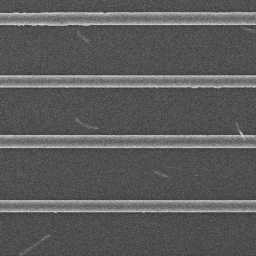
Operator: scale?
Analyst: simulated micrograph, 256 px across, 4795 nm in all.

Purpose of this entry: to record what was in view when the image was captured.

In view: lines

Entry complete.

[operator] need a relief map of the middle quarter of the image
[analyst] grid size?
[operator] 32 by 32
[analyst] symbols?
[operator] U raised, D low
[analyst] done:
DDDDDDDDDDDDDDDDDDDDDDDDDDDDDDDD
DDDDDDDDDDDDDDDDDDDDDDDDDDDDDDDD
DDDDDDDDDDDDDDDDDDDDDDDDDDDDDDDD
UUUUUUUUUUUUUUUUUUUUUUUUUUUUUUUU
UUUUUUUUUUUUUUUUUUUUUUUUUUUUUUUU
UUUUUUUUUUUUUUUUUUUUUUUUUUUUUUUU
DDDDDDDDDDDDDDDDDDDDDDDDDDDDDDDD
DDDDDDDDDDDDDDDDDDDDDDDDDDDDDDDD
DDDDDDDDDDDDDDDDDDDDDDDDDDDDDDDD
DDDDDDDDDDDDDDDDDDDDDDDDDDDDDDDD
DDDDDDDDDDDDDDDDDDDDDDDDDDDDDDDD
DDDDDDDDDDDDDDDDDDDDDDDDDDDDDDDD
DDDDDDDDDDDDDDDDDDDDDDDDDDDDDDDD
DDDDDDDDDDDDDDDDDDDDDDDDDDDDDDDD
DDDDDDDDDDDDDDDDDDDDDDDDDDDDDDDD
DDDDDDDDDDDDDDDDDDDDDDDDDDDDDDDD
DDDDDDDDDDDDDDDDDDDDDDDDDDDDDDDD
DDDDDDDDDDDDDDDDDDDDDDDDDDDDDDDD
UUUUUUUUUUUUUUUUUUUUUUUUUUUUUUUU
UUUUUUUUUUUUUUUUUUUUUUUUUUUUUUUU
UUUUUUUUUUUUUUUUUUUUUUUUUUUUUUUU
DDDDDDDDDDDDDDDDDDDDDDDDDDDDDDDD
DDDDDDDDDDDDDDDDDDDDDDDDDDDDDDDD
DDDDDDDDDDDDDDDDDDDDDDDDDDDDDDDD
DDDDDDDDDDDDDDDDDDDDDDDDDDDDDDDD
DDDDDDDDDDDDDDDDDDDDDDDDDDDDDDDD
DDDDDDDDDDDDDDDDDDDDDDDDDDDDDDDD
DDDDDDDDDDDDDDDDDDDDDDDDDDDDDDDD
DDDDDDDDDDDDDDDDDDDDDDDDDDDDDDDD
DDDDDDDDDDDDDDDDDDDDDDDDDDDDDDDD
DDDDDDDDDDDDDDDDDDDDDDDDDDDDDDDD
DDDDDDDDDDDDDDDDDDDDDDDDDDDDDDDD